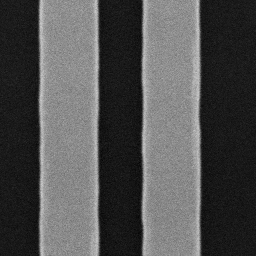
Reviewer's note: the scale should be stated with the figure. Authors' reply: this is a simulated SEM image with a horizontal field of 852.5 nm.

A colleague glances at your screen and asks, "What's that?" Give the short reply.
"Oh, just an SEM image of wiring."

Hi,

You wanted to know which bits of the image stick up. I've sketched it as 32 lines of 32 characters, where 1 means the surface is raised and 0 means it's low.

00000111111100000011111110000000
00000111111100000011111110000000
00000111111100000011111110000000
00000111111100000011111110000000
00000111111100000011111110000000
00000111111100000011111110000000
00000111111100000011111110000000
00000111111100000011111110000000
00000111111100000011111110000000
00000111111100000011111110000000
00000111111100000011111110000000
00000111111100000011111110000000
00000111111100000011111110000000
00000111111100000011111110000000
00000111111100000011111110000000
00000111111100000011111110000000
00000111111100000011111110000000
00000111111100000011111110000000
00000111111100000011111110000000
00000111111100000011111110000000
00000111111100000011111110000000
00000111111100000011111110000000
00000111111100000011111110000000
00000111111100000011111110000000
00000111111100000011111110000000
00000111111100000011111110000000
00000111111100000011111110000000
00000111111100000011111110000000
00000111111100000011111110000000
00000111111100000011111110000000
00000111111100000011111110000000
00000111111100000011111110000000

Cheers